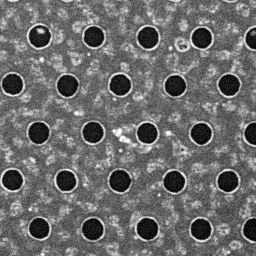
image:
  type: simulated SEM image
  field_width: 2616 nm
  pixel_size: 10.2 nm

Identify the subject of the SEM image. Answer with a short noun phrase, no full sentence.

a regular array of holes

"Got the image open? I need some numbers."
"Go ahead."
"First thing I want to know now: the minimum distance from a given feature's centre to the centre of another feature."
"549 nanometers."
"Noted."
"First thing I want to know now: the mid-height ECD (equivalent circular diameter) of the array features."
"230 nm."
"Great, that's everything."